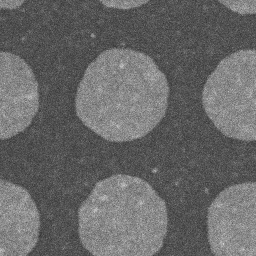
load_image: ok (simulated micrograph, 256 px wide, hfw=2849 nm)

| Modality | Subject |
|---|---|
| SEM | raised bodies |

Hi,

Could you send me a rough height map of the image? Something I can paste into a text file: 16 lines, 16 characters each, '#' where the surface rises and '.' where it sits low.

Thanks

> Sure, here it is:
#......#......##
................
................
#.....###.....##
##...#####...###
##...#####...###
##...#####...###
##...#####...###
#.....###.....##
................
................
#.....###......#
##...#####...###
##...#####...###
##...#####...###
##...#####...###